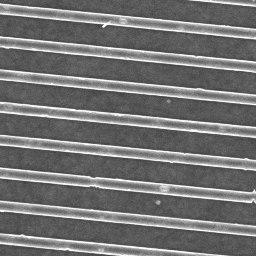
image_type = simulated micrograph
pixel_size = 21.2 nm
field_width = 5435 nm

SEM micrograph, parallel lines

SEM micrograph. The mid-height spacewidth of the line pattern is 22.8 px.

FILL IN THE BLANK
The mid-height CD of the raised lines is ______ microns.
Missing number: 0.214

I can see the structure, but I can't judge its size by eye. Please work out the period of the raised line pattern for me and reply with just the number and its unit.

694 nanometers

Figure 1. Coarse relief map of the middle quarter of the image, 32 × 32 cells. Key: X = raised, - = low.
--------------------------------
--------------------------------
--------------------------------
XXXX----------------------------
XXXXXXXXXXXXXX------------------
XXXXXXXXXXXXXXXXXXXXXXXX--------
-----------XXXXXXXXXXXXXXXXXXXXX
---------------------XXXXXXXXXXX
-------------------------------X
--------------------------------
--------------------------------
XXX-----------------------------
XXXXXXXXXXXXXX------------------
XXXXXXXXXXXXXXXXXXXXXXXX--------
----------XXXXXXXXXXXXXXXXXXXXXX
------------------XXXXXXXXXXXXXX
------------------------------XX
--------------------------------
--------------------------------
X-------------------------------
XXXXXXXXXXX---------------------
XXXXXXXXXXXXXXXXXXXXX-----------
--------XXXXXXXXXXXXXXXXXXXXXXXX
------------------XXXXXXXXXXXXXX
--------------------------XXXXXX
--------------------------------
--------------------------------
--------------------------------
XXXXXXX-X-----------------------
XXXXXXXXXXXXXXXXXXX-------------
-----XXXXXXXXXXXXXXXXXXXXXXXX---
---------------XXXXXXXXXXXXXXXXX